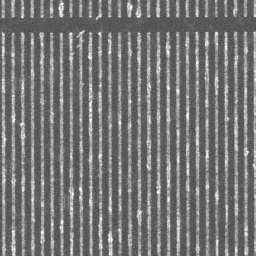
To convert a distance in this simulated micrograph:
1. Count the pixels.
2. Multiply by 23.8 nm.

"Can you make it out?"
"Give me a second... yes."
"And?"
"parallel lines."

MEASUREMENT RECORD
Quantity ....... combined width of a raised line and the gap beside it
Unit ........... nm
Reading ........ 230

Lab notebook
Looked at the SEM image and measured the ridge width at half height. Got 0.0446 µm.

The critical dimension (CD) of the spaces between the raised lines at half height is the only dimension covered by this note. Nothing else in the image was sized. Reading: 0.184 um